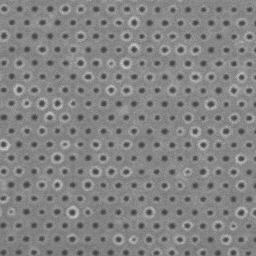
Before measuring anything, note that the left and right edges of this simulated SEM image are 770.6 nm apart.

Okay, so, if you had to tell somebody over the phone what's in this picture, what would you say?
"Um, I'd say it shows a regular array of holes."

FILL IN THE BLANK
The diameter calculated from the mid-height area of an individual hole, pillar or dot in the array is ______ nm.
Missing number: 17.3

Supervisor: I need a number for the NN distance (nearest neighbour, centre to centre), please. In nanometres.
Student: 44.8